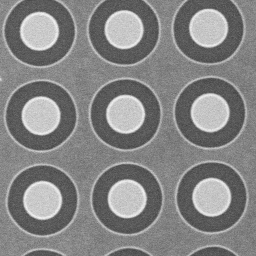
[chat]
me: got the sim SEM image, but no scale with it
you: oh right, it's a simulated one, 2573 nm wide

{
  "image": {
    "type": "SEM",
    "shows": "an array of small figures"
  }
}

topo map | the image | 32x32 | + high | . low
++......++++.......++++......+++
+........+++...+...+++...++...++
+..++++..++...+++...++..++++..++
+..++++..++..+++++..++..++++...+
+..++++..++..+++++..++..++++..++
+..++++..++...+++...++...++...++
+........+++.......++++......+++
++......+++++.....++++++....++++
++++++++++++++++++++++++++++++++
++++++++++++++++++++++++++++++++
+++....++++++.....++++++.....+++
++......++++.......++++.......++
+...++...+++..+++...++...+++..++
+..++++..++...++++..++..++++...+
+..++++...+..+++++..++..++++...+
+..++++..++...++++..++..++++..++
+...++...+++........+++.......++
++......+++++......++++......+++
+++....+++++++...+++++++++.+++++
++++++++++++++++++++++++++++++++
+++++++++++++++..++++++++...++++
+++.....+++++......++++.......++
++.......+++........+++...+...++
+...+++..+++..++++..++..++++...+
+..++++...++..++++..++..+++++..+
+..+++++..++..++++..++..+++++..+
+...+++...++..+++...++...+++..++
++.......+++.......++++.......++
+++.....+++++.....++++++.....+++
+++++.++++++++++++++++++++++++++
++++++++++++++++++++++++++++++++
++++...+++++++....++++++.....+++